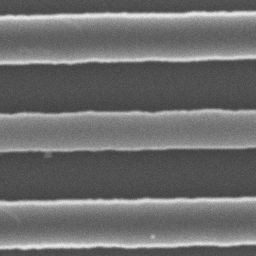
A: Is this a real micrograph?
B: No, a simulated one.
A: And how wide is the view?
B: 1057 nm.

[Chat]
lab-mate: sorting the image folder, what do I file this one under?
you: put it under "lines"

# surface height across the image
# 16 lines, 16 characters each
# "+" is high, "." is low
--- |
................
++++++++++++++++
++++++++++++++++
++++++++++++++++
................
................
................
++++++++++++++++
++++++++++++++++
................
................
................
.........+++++++
++++++++++++++++
++++++++++++++++
++..............